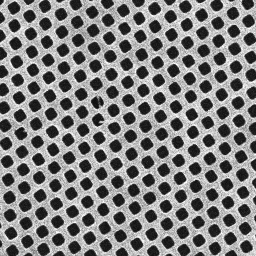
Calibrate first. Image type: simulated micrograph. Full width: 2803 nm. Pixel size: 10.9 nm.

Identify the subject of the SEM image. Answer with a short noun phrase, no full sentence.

a regular array of holes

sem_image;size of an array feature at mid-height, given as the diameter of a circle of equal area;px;12.2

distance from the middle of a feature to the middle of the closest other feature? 0.194 µm